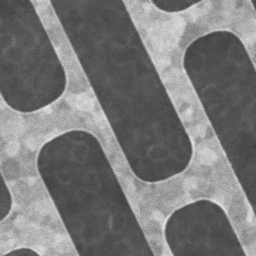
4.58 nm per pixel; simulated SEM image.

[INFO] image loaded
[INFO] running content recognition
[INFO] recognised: one or a few lines or trenches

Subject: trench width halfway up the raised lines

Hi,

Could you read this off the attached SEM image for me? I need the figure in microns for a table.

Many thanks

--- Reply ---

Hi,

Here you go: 0.305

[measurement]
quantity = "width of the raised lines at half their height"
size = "111 nm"